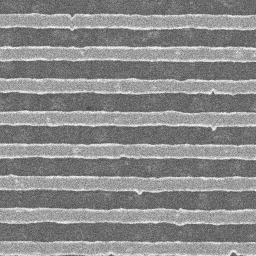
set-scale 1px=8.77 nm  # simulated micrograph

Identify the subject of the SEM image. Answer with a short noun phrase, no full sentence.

parallel lines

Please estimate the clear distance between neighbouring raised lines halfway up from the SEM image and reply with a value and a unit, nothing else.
168 nm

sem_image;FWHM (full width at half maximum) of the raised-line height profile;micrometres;0.117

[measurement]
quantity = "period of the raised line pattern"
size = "285 nanometres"